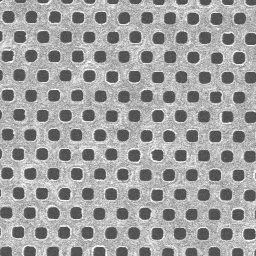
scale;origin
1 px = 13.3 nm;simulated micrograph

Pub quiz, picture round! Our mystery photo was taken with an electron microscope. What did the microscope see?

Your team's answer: a regular array of holes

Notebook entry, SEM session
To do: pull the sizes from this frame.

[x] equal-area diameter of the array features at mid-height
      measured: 169 nanometres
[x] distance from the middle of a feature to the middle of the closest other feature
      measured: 296 nm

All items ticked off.